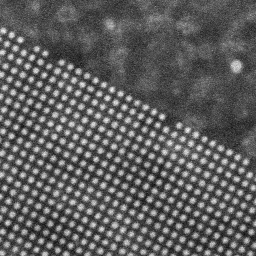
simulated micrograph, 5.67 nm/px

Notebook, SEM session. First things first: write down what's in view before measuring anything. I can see a regular array of raised bodies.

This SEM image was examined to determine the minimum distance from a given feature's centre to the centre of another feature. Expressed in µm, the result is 0.0532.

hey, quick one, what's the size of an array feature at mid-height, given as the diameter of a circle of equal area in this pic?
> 0.029 microns